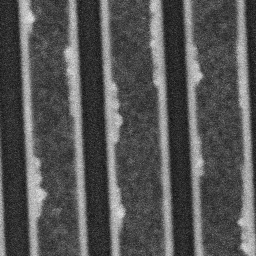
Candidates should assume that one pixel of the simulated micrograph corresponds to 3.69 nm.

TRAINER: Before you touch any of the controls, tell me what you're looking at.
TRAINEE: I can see one or a few lines or trenches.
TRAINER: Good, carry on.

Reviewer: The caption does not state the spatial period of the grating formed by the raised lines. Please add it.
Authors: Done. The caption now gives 307 nanometres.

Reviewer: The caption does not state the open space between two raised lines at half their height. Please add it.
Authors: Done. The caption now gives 30.9 pixels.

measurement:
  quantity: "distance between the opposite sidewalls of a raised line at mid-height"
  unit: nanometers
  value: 195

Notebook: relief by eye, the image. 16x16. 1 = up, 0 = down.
0111000111001110
0011100111001110
0011100111001110
0011100111001110
0011100111001110
0011100111001110
0011100111001110
0011100111001110
0011100111001110
0011100111001110
0011100111001110
0011100111001111
0011100111001111
0011100111001111
0011100111001111
0011100111101111